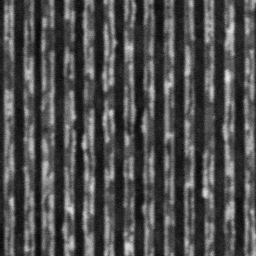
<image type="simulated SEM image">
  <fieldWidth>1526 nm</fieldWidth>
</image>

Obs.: parallel lines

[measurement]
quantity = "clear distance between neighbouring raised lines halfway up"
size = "64.8 nm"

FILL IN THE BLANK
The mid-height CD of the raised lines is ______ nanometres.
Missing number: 54.4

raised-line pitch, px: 20